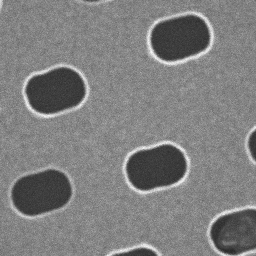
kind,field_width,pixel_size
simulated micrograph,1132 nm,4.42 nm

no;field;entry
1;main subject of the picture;holes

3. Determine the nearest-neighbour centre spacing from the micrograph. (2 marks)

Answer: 487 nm